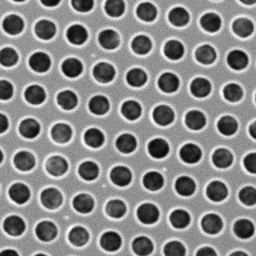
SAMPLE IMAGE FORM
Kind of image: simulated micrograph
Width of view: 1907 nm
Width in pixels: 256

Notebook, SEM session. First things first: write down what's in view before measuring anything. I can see a regular array of holes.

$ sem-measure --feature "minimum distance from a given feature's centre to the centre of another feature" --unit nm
241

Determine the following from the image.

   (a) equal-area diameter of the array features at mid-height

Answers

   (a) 159 nanometers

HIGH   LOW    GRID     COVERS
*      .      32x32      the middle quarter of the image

.....***....********************
.....**......****...************
....***......***.....****..*****
*.******....***......***.....***
*********..*****.....**......***
*****************...****.....**.
.***********************....***.
...*****************************
...****....*********************
....**.....****...**************
...***.....***.....****...******
..****.....***.....***.....*****
*******...****.....***......***.
***************....***......**..
***********************....***..
.***********************..*****.
..****...***********************
..***.....*****..***************
..***.....***.....**************
.****.....***.....***.....******
******...****.....***.....****..
**************....***.....***...
*********************.....***...
***********************..****...
.****..***********************..
.***....*****..*****************
.**......***....****************
****.....**......***....********
****....***......***.....***....
************.....***.....***....
*************...****.....***....
*********************...****....